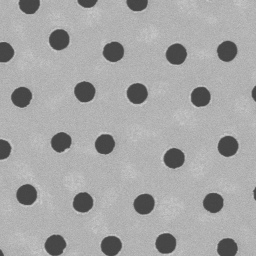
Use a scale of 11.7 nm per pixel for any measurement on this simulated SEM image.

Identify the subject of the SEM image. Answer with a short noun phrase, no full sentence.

a regular array of holes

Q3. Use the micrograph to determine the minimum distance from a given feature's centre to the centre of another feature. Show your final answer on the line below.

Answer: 49.2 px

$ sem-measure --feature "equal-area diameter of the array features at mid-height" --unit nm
240